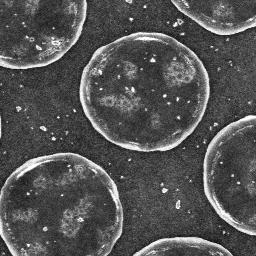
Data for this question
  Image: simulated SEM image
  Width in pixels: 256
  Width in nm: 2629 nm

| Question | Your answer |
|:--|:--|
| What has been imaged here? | raised bodies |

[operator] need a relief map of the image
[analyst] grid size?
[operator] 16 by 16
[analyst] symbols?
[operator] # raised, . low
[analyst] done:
#####......#####
#####........###
#####..####.....
####..######....
.....########...
.....########...
.....########...
......######...#
.......#####..##
.............###
.#####.......###
#######......###
#######......###
########......##
########.......#
.######..#####..